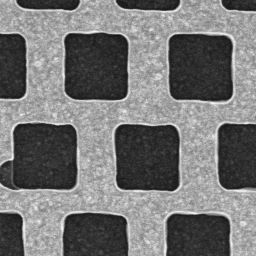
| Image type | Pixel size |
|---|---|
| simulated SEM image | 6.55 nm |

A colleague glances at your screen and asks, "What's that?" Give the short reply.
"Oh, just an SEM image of holes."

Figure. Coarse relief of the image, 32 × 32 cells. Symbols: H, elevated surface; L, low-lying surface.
HHLLLLLLLLHHHHHLLLLLLLHHHHHHLLLL
HHHHHHHHHHHHHHHHHHHHHHHHHHHHHHHH
HHHHHHHHHHHHHHHHHHHHHHHHHHHHHHHH
HHHHHHHHHHHHHHHHHHHHHHHHHHHHHHHH
LLLHHHHHLLLLLLLHHHHHHHLLLLLLHHHH
LLLHHHHHLLLLLLLLHHHHHLLLLLLLLHHH
LLLHHHHHLLLLLLLLHHHHHLLLLLLLLHHH
LLLHHHHHLLLLLLLLHHHHHLLLLLLLLHHH
LLLHHHHHLLLLLLLLHHHHHLLLLLLLLHHH
LLLHHHHHLLLLLLLLHHHHHLLLLLLLLHHH
LLLHHHHHLLLLLLLLHHHHHLLLLLLLLHHH
LLLHHHHHLLLLLLLLHHHHHLLLLLLLLHHH
HHHHHHHHHHLHHLLHHHHHHHLLHLLLLHHH
HHHHHHHHHHHHHHHHHHHHHHHHHHHHHHHH
HHHHHHHHHHHHHHHHHHHHHHHHHHHHHHHH
HHLLLLLHHHHHHHHHLHHHHHHHHHHHLLLL
HHLLLLLLLLHHHHLLLLLLLLHHHHHLLLLL
HHLLLLLLLLHHHHLLLLLLLLHHHHHLLLLL
HHLLLLLLLLHHHHLLLLLLLLHHHHHLLLLL
HHLLLLLLLLHHHHLLLLLLLLHHHHHLLLLL
LLLLLLLLLLHHHHHLLLLLLLHHHHHLLLLL
LLLLLLLLLLHHHHHLLLLLLLLHHHHLLLLL
LLLLLLLLLLHHHHLLLLLLLLLHHHHLLLLL
HLLLLLLLLHHHHHHLLLLLLLHHHHHHLLLL
HHHHHHHHHHHHHHHHHHHHHHHHHHHHHHHH
HHHHHHHHHHHHHHHHHHHHHHHHHHHHHHHH
LLHHHHHHHHHHHHHHHHHHHHHHHHHHHHHH
LLLHHHHHLLLLLLLLHHHHHLLLLLLLLHHH
LLLHHHHHLLLLLLLLHHHHHLLLLLLLLHHH
LLLHHHHHLLLLLLLLHHHHHLLLLLLLLHHH
LLLHHHHHLLLLLLLLHHHHHLLLLLLLLHHH
LLLHHHHHLLLLLLLLHHHHHLLLLLLLLHHH